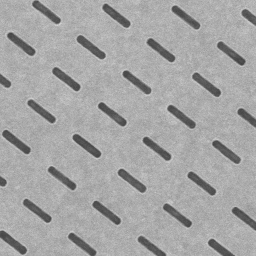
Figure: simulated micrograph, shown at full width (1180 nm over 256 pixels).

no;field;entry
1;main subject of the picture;a regular array of holes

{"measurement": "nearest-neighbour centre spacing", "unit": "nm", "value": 186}